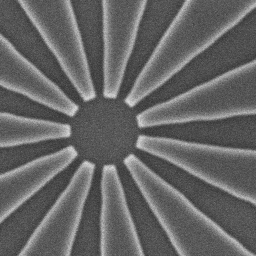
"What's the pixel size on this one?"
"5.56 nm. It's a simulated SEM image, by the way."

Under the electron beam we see groups of lines, slits or small figures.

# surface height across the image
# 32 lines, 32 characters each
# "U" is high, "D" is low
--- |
DDDUUUUUUDDDDUUUUUDDDDDUUUUUUUUU
DDDUUUUUUDDDDUUUUUDDDDUUUUUUUUUD
DDDDUUUUUDDDDUUUUDDDDDUUUUUUUUDD
DDDDDUUUUUDDDUUUUDDDDUUUUUUUUDDD
DDDDDUUUUUDDDUUUUDDDDUUUUUUDDDDD
UDDDDDUUUUDDDUUUUDDDUUUUUUDDDDDD
UUDDDDDUUUDDDUUUDDDUUUUUUDDDDDDD
UUUDDDDUUUUDDUUUDDDUUUUUDDDDDDDD
UUUUDDDDUUUDDUUUDDUUUUUDDDDDDDUU
UUUUUUDDDUUDDUUDDUUUUDDDDDDDUUUU
UUUUUUUDDUUDDUUDDUUUDDDDDDUUUUUU
DDUUUUUUDDUUDUUDUUUDDDDUUUUUUUUU
DDDDUUUUUDDDDDDDUDDDDUUUUUUUUUUU
DDDDDDDUUUDDDDDDDDDUUUUUUUUUUUUU
UUDDDDDDDDDDDDDDDUUUUUUUUUUUUDDD
UUUUUUUUDDDDDDDDDUUUDDDDDDDDDDDD
UUUUUUUUUDDDDDDDDDDDDDDDDDDDDDDD
UUUUUDDDDDDDDDDDDUUUUUDDDDDDDDDD
DDDDDDDDUDDDDDDDDUUUUUUUUUUUDDDD
DDDDDDUUUDDDDDDDUDDDUUUUUUUUUUUU
DDDUUUUUUDUDDDDDUUDDDDUUUUUUUUUU
DUUUUUUDDDUUDUUDUUUDDDDDUUUUUUUU
UUUUUUDDDUUDDUUDDUUUDDDDDDUUUUUU
UUUUUDDDUUUDDUUDDUUUUUDDDDDDUUUU
UUUUDDDDUUUDDUUDDDUUUUUDDDDDDDUU
UUUDDDDUUUDDDUUUDDDUUUUUDDDDDDDD
UDDDDDUUUUDDDUUUDDDUUUUUUDDDDDDD
DDDDDUUUUUDDDUUUDDDDUUUUUUDDDDDD
DDDDDUUUUUDDDUUUUDDDDUUUUUUDDDDD
DDDDUUUUUDDDDUUUUDDDDUUUUUUUUDDD
DDDUUUUUUDDDDUUUUDDDDDUUUUUUUUDD
DDDUUUUUUDDDDUUUUUDDDDUUUUUUUUUD